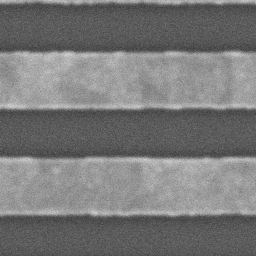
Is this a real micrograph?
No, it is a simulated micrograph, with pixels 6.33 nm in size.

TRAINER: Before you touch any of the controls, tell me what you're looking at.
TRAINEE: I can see lines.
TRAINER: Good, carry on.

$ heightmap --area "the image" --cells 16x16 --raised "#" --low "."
................
................
................
################
################
################
################
................
................
................
################
################
################
................
................
................